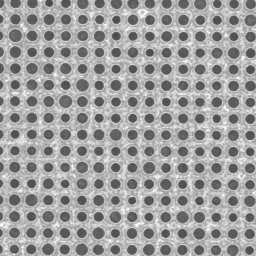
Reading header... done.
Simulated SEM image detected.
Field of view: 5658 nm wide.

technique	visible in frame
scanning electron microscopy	a regular array of holes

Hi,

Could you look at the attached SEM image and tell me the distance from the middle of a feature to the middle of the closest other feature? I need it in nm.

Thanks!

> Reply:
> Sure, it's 361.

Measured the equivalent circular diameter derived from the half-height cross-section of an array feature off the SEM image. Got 234 nm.